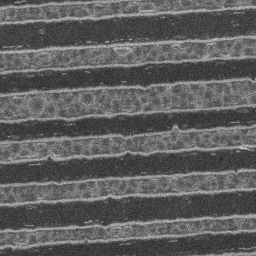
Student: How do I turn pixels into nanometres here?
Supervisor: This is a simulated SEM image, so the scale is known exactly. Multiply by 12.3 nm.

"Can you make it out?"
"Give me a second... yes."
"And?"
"parallel lines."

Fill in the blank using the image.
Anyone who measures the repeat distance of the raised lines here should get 547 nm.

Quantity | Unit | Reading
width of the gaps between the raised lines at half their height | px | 23.7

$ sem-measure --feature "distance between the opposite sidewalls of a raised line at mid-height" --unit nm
242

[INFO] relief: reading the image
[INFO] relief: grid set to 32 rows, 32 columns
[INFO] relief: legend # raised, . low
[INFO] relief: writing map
......#.########################
#######################.........
########........................
................................
................................
..................##############
...#############################
#########################.......
#########.......................
................................
......................##########
....#.##########################
################################
#############################...
###########.....................
................................
.....................###########
.....###########################
#############################...
##############..................
................................
.............................###
...........#####################
################################
################................
##..............................
................................
......................#.########
........########################
#####################.#.........
#####...........................
................................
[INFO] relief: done